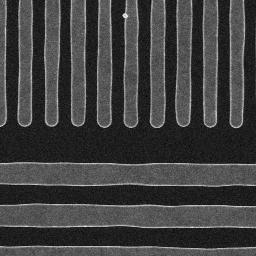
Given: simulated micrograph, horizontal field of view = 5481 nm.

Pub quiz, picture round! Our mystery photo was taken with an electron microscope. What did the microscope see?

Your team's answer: groups of lines, slits or small figures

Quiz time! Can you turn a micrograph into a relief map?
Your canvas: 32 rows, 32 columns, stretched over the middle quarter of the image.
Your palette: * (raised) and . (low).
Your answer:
..***...****...***....***...****
..***...****...***....***...***.
..***...****...***....***...***.
..***...****...***....***...****
..***...****...***....***...****
..***...****...***....***...****
..***...****...***....***...****
..***...****...***....***...****
..***...****...***....***...****
..***...****...***....***...****
..***...****...***....***...****
..***...****...***....***...***.
..***...****...***....***...***.
..***...****...***....***...***.
..***...****...***....***...***.
.........**.....**....**.....*..
................................
................................
................................
................................
................................
................................
................................
................................
................................
********************************
********************************
********************************
********************************
********************************
................................
................................